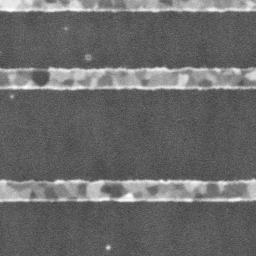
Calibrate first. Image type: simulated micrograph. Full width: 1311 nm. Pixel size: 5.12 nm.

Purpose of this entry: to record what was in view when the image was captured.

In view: lines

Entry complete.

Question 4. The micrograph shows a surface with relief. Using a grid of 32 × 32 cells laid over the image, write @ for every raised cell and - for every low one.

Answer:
@@@@@@@@@@@@@@@@@@@@@@@@@@@@@@@@
--------------------------------
--------------------------------
--------------------------------
--------------------------------
--------------------------------
--------------------------------
--------------------------------
-----------------------@--------
@@@@@@@@@@@@@@@@@@@@@@@@@@@@@@@@
@@@@@@@@@@@@@@@@@@@@@@@@@@@@@@@@
--------------------------------
--------------------------------
--------------------------------
--------------------------------
--------------------------------
--------------------------------
--------------------------------
--------------------------------
--------------------------------
--------------------------------
--------------------------------
--------------------------------
@@@@@@@@@@@@@@@@@@@@@@@@@@@@@@@@
@@@@@@@@@@@@@@@@@@@@@@@@@@@@@@@@
--------------------------------
--------------------------------
--------------------------------
--------------------------------
--------------------------------
--------------------------------
--------------------------------